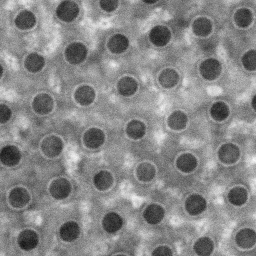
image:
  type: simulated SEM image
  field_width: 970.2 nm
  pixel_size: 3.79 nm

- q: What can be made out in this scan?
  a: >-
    a regular array of raised bodies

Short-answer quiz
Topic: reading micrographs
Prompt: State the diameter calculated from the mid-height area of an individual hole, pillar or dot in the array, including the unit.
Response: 89.3 nanometres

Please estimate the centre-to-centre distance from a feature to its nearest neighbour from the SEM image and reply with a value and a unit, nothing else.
0.161 um